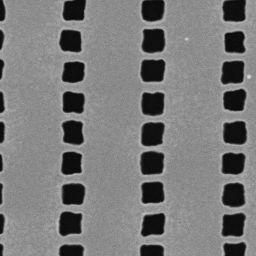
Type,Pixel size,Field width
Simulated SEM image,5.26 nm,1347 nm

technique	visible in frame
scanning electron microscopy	a regular array of holes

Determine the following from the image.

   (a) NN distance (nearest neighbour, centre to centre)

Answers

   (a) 159 nm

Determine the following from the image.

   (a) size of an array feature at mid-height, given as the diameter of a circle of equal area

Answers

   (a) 0.121 micrometres